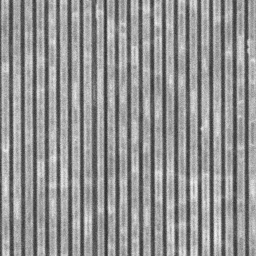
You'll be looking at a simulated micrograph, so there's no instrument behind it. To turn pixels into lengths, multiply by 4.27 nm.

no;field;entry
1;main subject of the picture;parallel lines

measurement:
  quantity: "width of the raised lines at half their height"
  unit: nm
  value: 28.8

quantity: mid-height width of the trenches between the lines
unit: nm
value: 20.3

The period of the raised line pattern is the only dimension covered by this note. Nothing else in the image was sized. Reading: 50.2 nm